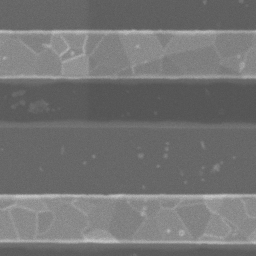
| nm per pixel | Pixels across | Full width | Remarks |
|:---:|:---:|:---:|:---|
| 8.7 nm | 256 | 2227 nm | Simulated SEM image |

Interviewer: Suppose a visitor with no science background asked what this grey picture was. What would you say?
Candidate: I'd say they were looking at lines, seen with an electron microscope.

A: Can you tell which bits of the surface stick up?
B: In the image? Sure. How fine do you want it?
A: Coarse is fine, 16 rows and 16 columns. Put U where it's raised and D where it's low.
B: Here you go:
UUUUUUUUUUUUUUUU
UUUUUUUUUUUUUUUU
UUUUUUUUUUUUUUUU
UUUUUUUUUUUUUUUU
UUUUUUUUUUUUUUUU
DDDDDDDDDDDDDDDD
DDDDDDDDDDDDDDDD
DDDDDDDDDDDDDDDD
UUUUUUUUUUUUUUUU
UUUUUUUUUUUUUUUU
UUUUUUUUUUUUUUUU
UUUUUUUUUUUUUUUU
UUUUUUUUUUUUUUUU
UUUUUUUUUUUUUUUU
UUUUUUUUUUUUUUUU
DDDDDDDDDDDDDDDD